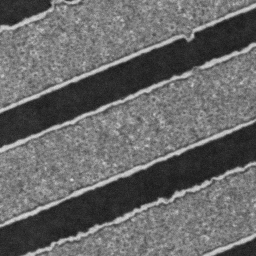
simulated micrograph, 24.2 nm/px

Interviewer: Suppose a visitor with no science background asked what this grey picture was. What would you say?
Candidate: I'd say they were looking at one or a few lines or trenches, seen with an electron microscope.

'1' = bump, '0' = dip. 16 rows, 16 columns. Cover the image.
0001111111111111
0111111111111000
1111111111100000
1111111100000011
1111110000001111
1110000001111111
1000000111111111
0000011111111111
0011111111111100
1111111111100000
1111111110000001
1111110000000111
1111000000011111
1000000011111111
0000001111111111
0001111111111100